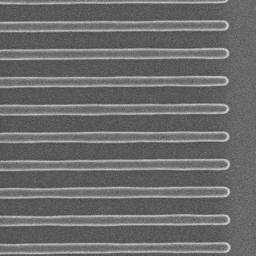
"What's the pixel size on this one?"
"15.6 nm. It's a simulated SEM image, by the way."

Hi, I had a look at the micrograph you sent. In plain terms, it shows groups of lines, slits or small figures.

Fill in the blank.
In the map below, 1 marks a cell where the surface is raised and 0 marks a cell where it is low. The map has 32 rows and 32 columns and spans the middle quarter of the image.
00000000000000000000000000000000
00000000000000000000000000000000
00000000000000000000000000000000
00000000000001111111111111111111
11111111111111111111111111111111
11111110000000000000000000000000
00000000000000000000000000000000
00000000000000000000000000000000
00000000000000000000000000000000
00000000000000000000000000000000
11111111111111111111111111111111
11111111111111111111111111111111
00111111100000000000000000000000
00000000000000000000000000000000
00000000000000000000000000000000
00000000000000000000000000000000
00000000000000000000000000000000
11111111111111111111111111111111
11111111111111111111111111111111
00000111111111110000000000000000
00000000000000000000000000000000
00000000000000000000000000000000
00000000000000000000000000000000
00000000000000000000000000000000
11111111111111111111111111111111
11111111111111111111111111111111
00000000000000000000000000000000
00000000000000000000000000000000
00000000000000000000000000000000
00000000000000000000000000000000
00000000000000000000000000000000
11111111111111111111111111111111